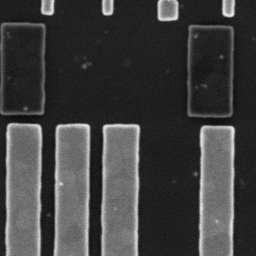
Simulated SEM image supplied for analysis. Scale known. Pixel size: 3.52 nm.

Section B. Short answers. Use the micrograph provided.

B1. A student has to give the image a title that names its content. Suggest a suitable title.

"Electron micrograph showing wiring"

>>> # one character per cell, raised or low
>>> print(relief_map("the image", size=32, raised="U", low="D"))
DDDDDUUDDDDDDUDDDDDDUUDDDDDDUDDD
DDDDDUUDDDDDDUDDDDDDUUDDDDDDUDDD
DDDDDDDDDDDDDDDDDDDDUUDDDDDDDDDD
UUUUUUDDDDDDDDDDDDDDDDDDUUUUUDDD
UUUUUUDDDDDDDDDDDDDDDDDDUUUUUDDD
UUUUUUDDDDDDDDDDDDDDDDDDUUUUUDDD
UUUUUUDDDDDDDDDDDDDDDDDDUUUUUDDD
UUUUUUDDDDDDDDDDDDDDDDDDUUUUUDDD
UUUUUUDDDDDDDDDDDDDDDDDDUUUUUDDD
UUUUUUDDDDDDDDDDDDDDDDDDUUUUUDDD
UUUUUUDDDDDDDDDDDDDDDDDUUUUUUDDD
UUUUUUDDDDDDDDDDDDDDDDDDUUUUUDDD
UUUUUUDDDDDDDDDDDDDDDDDDUUUUUDDD
UUUUUDDDDDDDDDDDDDDDDDDDUUUUUDDD
DDDDDDDDDDDDDDDDDDDDDDDDUUUUUDDD
DUUDDDDDDDDDDDDDDDDDDDDDDDDDDDDD
DUUUUDDUUUUDDUUUUDDDDDDDDUUUUDDD
DUUUUDDUUUUDDUUUUDDDDDDDDUUUUDDD
DUUUUDDUUUUDDUUUUDDDDDDDDUUUUDDD
DUUUUDDUUUUDDUUUUDDDDDDDDUUUUDDD
DUUUUDDUUUUDDUUUUDDDDDDDDUUUUDDD
DUUUUDDUUUUDDUUUUDDDDDDDDUUUUDDD
DUUUUDDUUUUDDUUUUDDDDDDDDUUUUDDD
DUUUUDDUUUUDDUUUUDDDDDDDDUUUUDDD
DUUUUDDUUUUDDUUUUDDDDDDDDUUUUDDD
DUUUUDDUUUUDDUUUUDDDDDDDDUUUUDDD
DUUUUDDUUUUDDUUUUDDDDDDDDUUUUDDD
DUUUUDDUUUUDDUUUUDDDDDDDDUUUUDDD
DUUUUDDUUUUDDUUUUDDDDDDDDUUUUDDD
DUUUUDDUUUUDDUUUUDDDDDDDDUUUUDDD
DUUUUDDUUUUDDUUUUDDDDDDDDUUUUDDD
DUUUUDDUUUUDDUUUUDDDDDDDDUUUUDDD